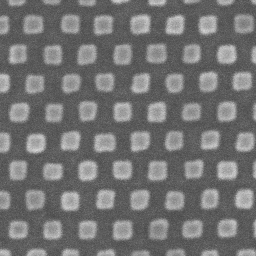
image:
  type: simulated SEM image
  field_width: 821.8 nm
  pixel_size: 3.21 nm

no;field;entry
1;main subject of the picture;a regular array of raised bodies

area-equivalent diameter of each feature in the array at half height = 59.1 nanometres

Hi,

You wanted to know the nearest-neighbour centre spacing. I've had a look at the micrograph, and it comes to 0.107 um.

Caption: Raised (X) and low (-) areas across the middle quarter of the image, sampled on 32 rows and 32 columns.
--------------------------------
--------------------------------
--------------------------------
XXXX----XXXX-----XXXX-----XXX---
XXXX----XXXX-----XXXX-----XXX---
XXXX----XXXX-----XXXX-----XXX---
XXX------XXX-----XXXX-----XXX---
--------------------------------
--------------------------------
--------------------------------
----XXXX-----XXX-----XXXX-----XX
----XXXX-----XXXX----XXXX-----XX
----XXXX-----XXXX----XXXX-----XX
----XXX------XXX-----XXXX-----XX
--------------------------------
--------------------------------
--------------------------------
XXXX-------------XXXX-----XXXX--
XXXX----XXXXX----XXXX-----XXXX--
XXXX----XXXXX----XXXX-----XXX---
XXX-----XXXXX----XXXX-----XXX---
--------XX-X-----XX-------------
--------------------------------
--------------------------------
--------------X-----------------
----XXXX----XXXXX-----XXX-----XX
----XXXX----XXXXX----XXXX-----XX
----XXXX-----XXXX----XXXX------X
----XXX-------X------XXXX-------
--------------------------------
--------------------------------
--------------------------------